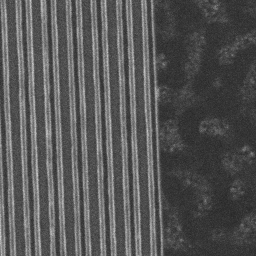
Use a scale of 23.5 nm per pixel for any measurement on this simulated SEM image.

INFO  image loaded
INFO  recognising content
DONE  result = parallel lines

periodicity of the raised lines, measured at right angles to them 300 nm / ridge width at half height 108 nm